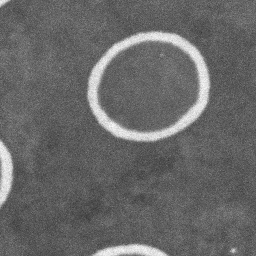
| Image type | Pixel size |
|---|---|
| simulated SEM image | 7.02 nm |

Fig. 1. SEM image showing raised bodies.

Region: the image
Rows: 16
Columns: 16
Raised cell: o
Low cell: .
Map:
................
................
........ooo.....
.......ooooo....
......ooooooo...
......ooooooo...
......ooooooo...
......oooooo....
.........o......
................
................
................
................
................
................
................